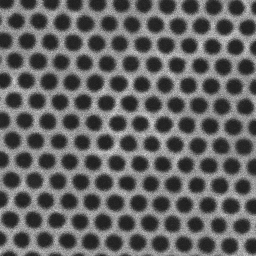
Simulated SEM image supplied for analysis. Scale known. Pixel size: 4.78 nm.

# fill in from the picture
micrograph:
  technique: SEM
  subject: a regular array of holes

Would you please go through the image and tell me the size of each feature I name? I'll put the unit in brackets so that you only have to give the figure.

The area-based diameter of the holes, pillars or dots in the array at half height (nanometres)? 83.9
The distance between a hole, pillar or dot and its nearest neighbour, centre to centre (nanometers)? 108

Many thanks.